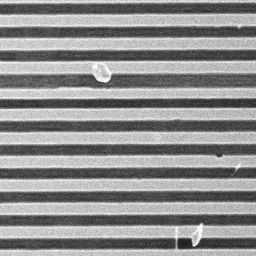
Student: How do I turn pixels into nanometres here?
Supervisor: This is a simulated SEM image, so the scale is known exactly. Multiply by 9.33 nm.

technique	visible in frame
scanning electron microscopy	parallel lines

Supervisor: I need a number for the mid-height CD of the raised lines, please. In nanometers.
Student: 128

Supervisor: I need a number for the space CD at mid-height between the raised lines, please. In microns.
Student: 0.0957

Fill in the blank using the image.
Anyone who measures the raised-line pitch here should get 219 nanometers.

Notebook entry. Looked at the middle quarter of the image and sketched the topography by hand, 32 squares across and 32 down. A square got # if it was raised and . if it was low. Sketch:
################################
################################
.......#####.......##...........
........####....................
..........#.....................
................................
################################
################################
################################
................................
................................
################################
################################
################################
................................
................................
................................
################################
################################
################################
................................
................................
................................
################################
################################
################################
................................
................................
................................
################################
################################
################################